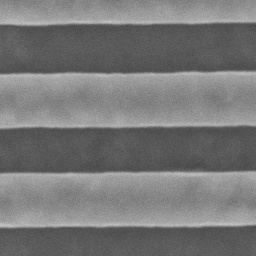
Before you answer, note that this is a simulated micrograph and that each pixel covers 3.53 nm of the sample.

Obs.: lines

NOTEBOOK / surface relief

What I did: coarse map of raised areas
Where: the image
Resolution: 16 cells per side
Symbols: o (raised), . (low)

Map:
oooooooooooooooo
oooo............
................
................
................
oooooooooooooooo
oooooooooooooooo
oooooooooooooooo
................
................
................
oooooooooooooooo
oooooooooooooooo
oooooooooooooooo
................
................